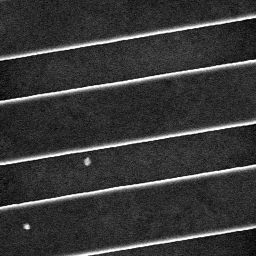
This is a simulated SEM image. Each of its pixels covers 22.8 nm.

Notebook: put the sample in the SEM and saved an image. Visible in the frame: lines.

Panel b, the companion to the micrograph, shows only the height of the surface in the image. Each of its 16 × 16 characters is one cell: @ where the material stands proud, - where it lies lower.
@@@@@@@@@@@@@@@@
@@@@@@@@@@@@@@--
@@@@@@@---------
@@--------------
-----------@@@@@
-----@@@@@@@@@@@
@@@@@@@@@@@@@@@@
@@@@@@@@@@@@@@@@
@@@@@@@@@@@-----
@@@@@-----------
---------------@
---------@@@@@@@
---@@@@@@@@@@@@@
@@@@@@@@@@@@@@@@
@@@@@@@@@@@@@@--
@@@@@@@@--------